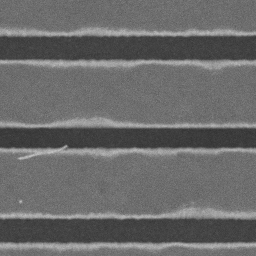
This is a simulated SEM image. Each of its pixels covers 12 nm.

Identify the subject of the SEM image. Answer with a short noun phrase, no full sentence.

lines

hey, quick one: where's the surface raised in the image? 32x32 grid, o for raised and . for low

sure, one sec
oooooooooooooooooooooooooooooooo
oooooooooooooooooooooooooooooooo
oooooooooooooooooooooooooooooooo
oooooooooooooooooooooooooooooooo
...o..o.........................
................................
................................
...oo...........................
oooooooooooooooooooooooooooooooo
oooooooooooooooooooooooooooooooo
oooooooooooooooooooooooooooooooo
oooooooooooooooooooooooooooooooo
oooooooooooooooooooooooooooooooo
oooooooooooooooooooooooooooooooo
oooooooooooooooooooooooooooooooo
oooooooooooooooooooooooooooooooo
................................
................................
o......oo..............o........
oooooooooooooooooooooooooooooooo
oooooooooooooooooooooooooooooooo
oooooooooooooooooooooooooooooooo
oooooooooooooooooooooooooooooooo
oooooooooooooooooooooooooooooooo
oooooooooooooooooooooooooooooooo
oooooooooooooooooooooooooooooooo
oooooooooooooooooooooooooooooooo
................................
................................
................................
ooooooooooooooooooo.oooooooooooo
oooooooooooooooooooooooooooooooo